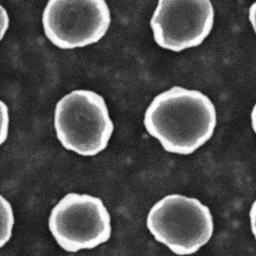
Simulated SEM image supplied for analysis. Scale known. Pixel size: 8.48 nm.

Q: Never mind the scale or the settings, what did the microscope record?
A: raised bodies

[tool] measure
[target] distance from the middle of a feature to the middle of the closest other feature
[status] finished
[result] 839 nm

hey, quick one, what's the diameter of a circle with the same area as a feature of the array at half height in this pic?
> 492 nm